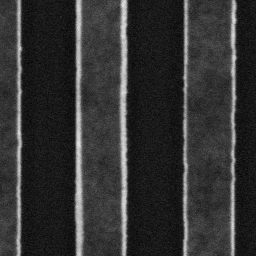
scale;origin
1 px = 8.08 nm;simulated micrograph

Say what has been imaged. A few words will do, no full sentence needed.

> lines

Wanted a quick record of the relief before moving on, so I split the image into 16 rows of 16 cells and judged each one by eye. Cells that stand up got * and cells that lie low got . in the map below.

*....***....***.
*....***....***.
*....***....***.
*....***....***.
*....***....***.
*....***....***.
*....***....***.
*....***....***.
*....***....***.
*....***....***.
*....***....***.
*....***....***.
*....***....***.
*....***....***.
*....***....***.
*....***....***.